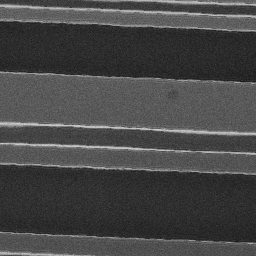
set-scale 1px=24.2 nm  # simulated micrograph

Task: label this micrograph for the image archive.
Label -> lines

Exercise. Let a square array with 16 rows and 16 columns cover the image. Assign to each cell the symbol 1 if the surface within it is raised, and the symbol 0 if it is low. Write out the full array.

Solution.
1111111111111111
0000001111111111
0000000000000000
0000000000000000
0000000000000000
1111111111111111
1111111111111111
1111111111111111
1111111111111111
1111111111111111
0000000011111111
0000000000000000
0000000000000000
0000000000000000
0000000000000000
1111111111111111